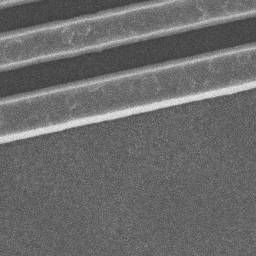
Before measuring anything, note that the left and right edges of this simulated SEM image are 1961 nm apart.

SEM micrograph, one or a few lines or trenches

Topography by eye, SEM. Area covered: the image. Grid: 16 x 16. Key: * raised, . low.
........********
....*********...
********........
****.........***
........********
....***********.
**********......
******..........
*...............
................
................
................
................
................
................
................